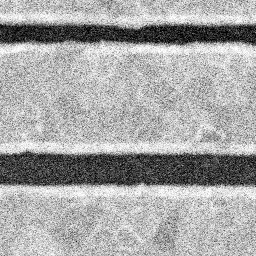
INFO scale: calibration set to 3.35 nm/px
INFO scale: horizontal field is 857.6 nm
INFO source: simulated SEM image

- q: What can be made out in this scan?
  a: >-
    one or a few lines or trenches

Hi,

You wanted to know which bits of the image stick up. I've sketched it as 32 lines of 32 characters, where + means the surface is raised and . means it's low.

++++++++++++++++++++++++++++++++
++++++++++++++++++++++++++++++++
++...+++++++++++++++++++++++++++
................................
................................
................................
++++++++++++++++++++++++++++++++
++++++++++++++++++++++++++++++++
++++++++++++++++++++++++++++++++
++++++++++++++++++++++++++++++++
++++++++++++++++++++++++++++++++
++++++++++++++++++++++++++++++++
++++++++++++++++++++++++++++++++
++++++++++++++++++++++++++++++++
++++++++++++++++++++++++++++++++
++++++++++++++++++++++++++++++++
++++++++++++++++++++++++++++++++
++++++++++++++++++++++++++++++++
++++++++++++++++++++++++++++++++
................................
................................
................................
................................
.................+..............
++++++++++++++++++++++++++++++++
++++++++++++++++++++++++++++++++
++++++++++++++++++++++++++++++++
++++++++++++++++++++++++++++++++
++++++++++++++++++++++++++++++++
++++++++++++++++++++++++++++++++
++++++++++++++++++++++++++++++++
++++++++++++++++++++++++++++++++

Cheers